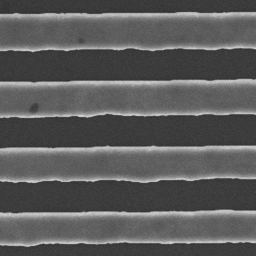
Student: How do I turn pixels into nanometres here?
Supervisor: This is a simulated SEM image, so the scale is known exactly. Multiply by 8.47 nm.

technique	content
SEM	lines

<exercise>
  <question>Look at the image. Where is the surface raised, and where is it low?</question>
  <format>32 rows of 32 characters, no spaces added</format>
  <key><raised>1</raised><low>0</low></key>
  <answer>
00000000000000000000000000000000
00000000000000000000000000000000
11111111111111111111111111111111
11111111111111111111111111111111
11111111111111111111111111111111
11111111111111111111111111111111
00000000000000000000000000000000
00000000000000000000000000000000
00000000000000000000000000000000
00000000000000000000000000000000
11111111111111111111111111111111
11111111111111111111111111111111
11111111111111111111111111111111
11111111111111111111111111111111
11111111111100000000000000000000
00000000000000000000000000000000
00000000000000000000000000000000
00000000000000000000000000000000
00000000000011111111111111111111
11111111111111111111111111111111
11111111111111111111111111111111
11111111111111111111111111111111
11111111111110111111000110000000
00000000000000000000000000000000
00000000000000000000000000000000
00000000000000000000000000000000
00000000000000000000000001111111
11111111111111111111111111111111
11111111111111111111111111111111
11111111111111111111111111111111
11111000000000000000000000000000
00000000000000000000000000000000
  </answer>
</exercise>